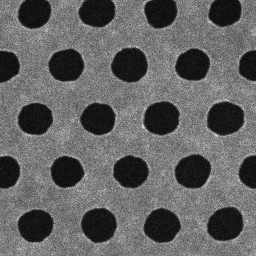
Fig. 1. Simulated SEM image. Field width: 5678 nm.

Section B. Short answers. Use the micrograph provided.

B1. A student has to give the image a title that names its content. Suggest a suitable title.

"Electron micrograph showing a regular array of holes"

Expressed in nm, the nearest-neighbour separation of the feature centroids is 1370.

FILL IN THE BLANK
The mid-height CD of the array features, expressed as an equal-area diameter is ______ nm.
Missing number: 777